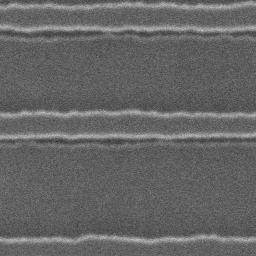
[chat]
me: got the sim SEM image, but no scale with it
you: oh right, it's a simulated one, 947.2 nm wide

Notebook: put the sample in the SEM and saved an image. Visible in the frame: lines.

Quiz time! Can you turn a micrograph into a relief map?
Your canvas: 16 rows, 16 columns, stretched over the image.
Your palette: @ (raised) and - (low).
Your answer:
@@@@@@@@@@@@@@@@
@@@@@@@@@@@@@@@@
----------------
----------------
----------------
----------------
----------------
@@@@@@@@@@@@@@@@
@@@@@@@@@@@@@@@@
----------------
----------------
----------------
----------------
----------------
----------------
@@@@@@@@@@@@@@@@